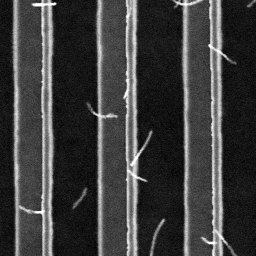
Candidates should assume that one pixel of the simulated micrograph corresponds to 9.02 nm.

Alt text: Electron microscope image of lines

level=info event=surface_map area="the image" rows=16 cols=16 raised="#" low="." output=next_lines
.##...##....##..
.##...##....##..
.##...##....##..
.##...##....##..
.##...##....##..
.##...##....##..
.##...##....##..
.##...##....##..
.##...##....##..
.##...###...##..
.##...##....##..
.##...##....##..
.##...##....##..
.##...##....##..
.##...##....##..
.##...##....##..